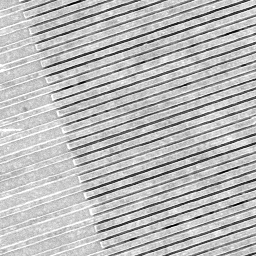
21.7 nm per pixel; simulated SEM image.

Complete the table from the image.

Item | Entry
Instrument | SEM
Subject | parallel lines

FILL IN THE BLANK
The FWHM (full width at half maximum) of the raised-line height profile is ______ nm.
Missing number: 128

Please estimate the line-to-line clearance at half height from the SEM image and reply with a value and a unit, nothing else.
2.61 px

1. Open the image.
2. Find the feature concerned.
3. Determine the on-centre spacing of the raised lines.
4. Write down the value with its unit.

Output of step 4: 188 nm